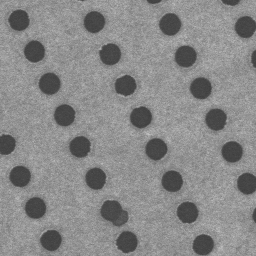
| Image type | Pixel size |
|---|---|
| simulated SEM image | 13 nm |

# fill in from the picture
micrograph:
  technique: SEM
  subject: a regular array of holes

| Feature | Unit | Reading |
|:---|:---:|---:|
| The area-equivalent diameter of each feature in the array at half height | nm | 280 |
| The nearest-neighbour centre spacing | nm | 453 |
